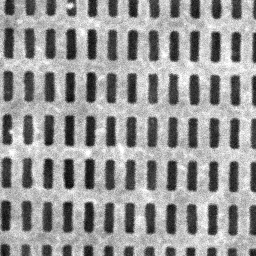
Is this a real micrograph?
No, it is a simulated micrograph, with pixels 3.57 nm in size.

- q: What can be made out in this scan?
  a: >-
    a regular array of holes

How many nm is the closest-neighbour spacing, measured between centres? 73.3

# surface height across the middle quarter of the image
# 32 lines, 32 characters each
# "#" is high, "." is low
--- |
################################
################################
...###..###..###..###..####.####
...##...###..###..###...##...##.
...##...###..###..###...##...##.
...##...###..###..###...##...##.
...##...###..###..###...##...##.
...##...##...###..###...##...##.
...##...##...###..###...##...##.
...###..###..###..###..###...##.
################################
################################
################################
...###..###..###..###..###..###.
...##...##...##...###...##...##.
...##...##...##...###...##...##.
...##...##...##...###..###...##.
...##...##...##...##...###...##.
...##...##...##...###..###...##.
...##...##...##...###..###...##.
#.###..####..###..###..###..###.
################################
################################
#.##############################
...##...##...##...###..###..###.
...##...##...##...##...###..###.
...##...##...##...##...###..###.
...##...##...##...##...###..###.
...##...##...##...##...###..###.
...##...##...##...###..###..###.
..###...##...##...##...###..###.
#.####.####.####..###..###..###.